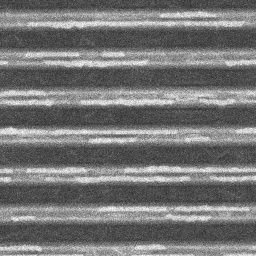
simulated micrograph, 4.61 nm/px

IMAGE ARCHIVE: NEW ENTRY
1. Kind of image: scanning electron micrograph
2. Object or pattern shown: parallel lines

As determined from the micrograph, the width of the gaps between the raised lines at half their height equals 100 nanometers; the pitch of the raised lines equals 179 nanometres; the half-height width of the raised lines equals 77.7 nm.